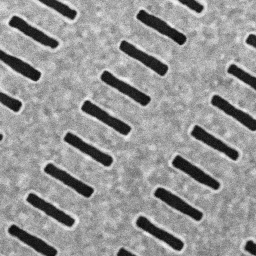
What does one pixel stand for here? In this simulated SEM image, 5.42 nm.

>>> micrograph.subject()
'a regular array of holes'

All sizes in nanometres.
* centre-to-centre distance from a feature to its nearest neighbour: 191